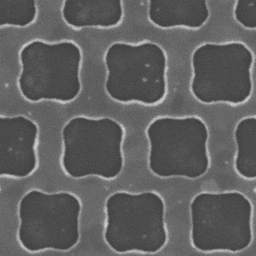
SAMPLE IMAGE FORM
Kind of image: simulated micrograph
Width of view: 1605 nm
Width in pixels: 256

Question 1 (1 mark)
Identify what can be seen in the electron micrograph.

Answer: a regular array of holes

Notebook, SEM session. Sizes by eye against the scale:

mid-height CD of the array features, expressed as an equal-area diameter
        400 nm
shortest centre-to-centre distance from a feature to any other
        85.6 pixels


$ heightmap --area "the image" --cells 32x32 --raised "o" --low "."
....oooo.......oooo.......oooo..
....oooo.......oooo.......ooo...
....oooo.......oooo.......oooo..
ooooooooooooooooooooooooooooooo.
oooooooooooooooooooooooooooooooo
oooo.....ooooo..oo.oooooooooo.oo
ooo.......ooo.......oooo.......o
ooo.......ooo........ooo.......o
ooo.......ooo........ooo.......o
ooo.......ooo........ooo.......o
oo........ooo........ooo.......o
ooo.......oooo.......ooo.......o
oooo.oo..oooooo.....ooooo......o
oooooooooooooooooooooooooooooooo
oooooooooooooooooooooooooooooooo
....oooo.......oooo......ooooo..
.....ooo.......ooo........ooo...
....oooo.......oooo.......ooo...
....oooo.......oooo.......oooo..
....oooo.......oooo.......oooo..
....oooo.......oooo.......ooo...
....oooo.......oooo.......oooo..
oooooooooooooooooooooooooooooooo
oooooooooooooooooooooooooooooooo
ooo......ooooo......ooooo.....oo
oo........ooo.......oooo.......o
oo........ooo.......oooo.......o
ooo.......ooo.......oooo.......o
oo........ooo........ooo.......o
oo........ooo........ooo.......o
ooo......ooooo......oooo.......o
oooooooooooooooooo.ooooooooooooo